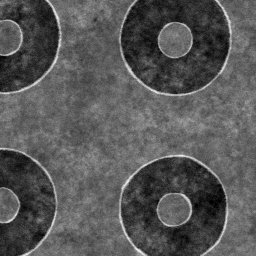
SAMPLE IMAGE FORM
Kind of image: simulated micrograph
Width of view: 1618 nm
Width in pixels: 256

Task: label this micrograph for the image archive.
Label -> ring-shaped grooves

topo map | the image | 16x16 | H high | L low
LLLHHHHHLLLLLLHH
HLLLHHHHLLLLLLHH
HLLLHHHHLLHHLLHH
LLLLHHHHLLLLLLHH
LLLHHHHHLLLLLLHH
LLHHHHHHHLLLLHHH
HHHHHHHHHHHHHHHH
HHHHHHHHHHHHHHHH
HHHHHHHHHHHHHHHH
LHHHHHHHHHHHHHHH
LLLHHHHHHLLLLHHH
LLLHHHHHLLLLLLHH
HLLLHHHHLLHHLLHH
HLLHHHHHLLHHLLHH
LLLHHHHHLLLLLLHH
LLHHHHHHHLLLLHHH